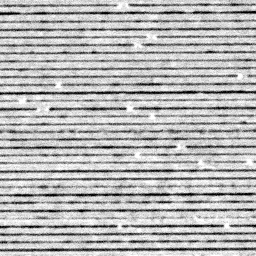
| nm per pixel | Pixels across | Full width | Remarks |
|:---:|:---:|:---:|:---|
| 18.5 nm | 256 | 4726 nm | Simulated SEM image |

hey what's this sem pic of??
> parallel lines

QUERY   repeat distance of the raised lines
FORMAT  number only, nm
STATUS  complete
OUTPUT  145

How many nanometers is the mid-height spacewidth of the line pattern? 55.4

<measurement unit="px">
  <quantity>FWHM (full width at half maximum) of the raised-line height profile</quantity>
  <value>5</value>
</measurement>